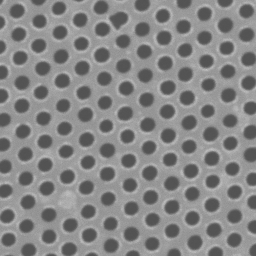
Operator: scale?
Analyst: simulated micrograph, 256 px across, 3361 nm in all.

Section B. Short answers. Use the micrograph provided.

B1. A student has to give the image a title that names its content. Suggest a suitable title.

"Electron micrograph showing a regular array of holes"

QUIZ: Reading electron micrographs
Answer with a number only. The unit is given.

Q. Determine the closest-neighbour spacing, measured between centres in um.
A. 0.299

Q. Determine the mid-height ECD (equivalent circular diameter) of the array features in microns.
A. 0.199